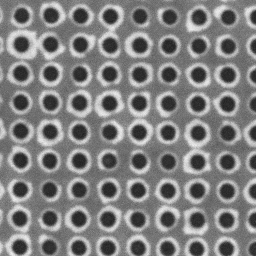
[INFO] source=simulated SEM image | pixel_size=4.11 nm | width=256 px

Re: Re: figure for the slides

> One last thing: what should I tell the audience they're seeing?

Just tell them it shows a regular array of holes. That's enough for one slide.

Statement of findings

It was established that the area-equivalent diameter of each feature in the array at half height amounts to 69.6 nanometers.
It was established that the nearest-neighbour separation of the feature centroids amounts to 118 nm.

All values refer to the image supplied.